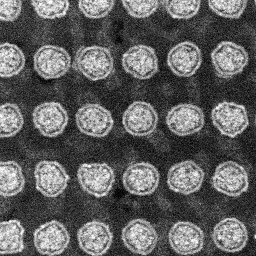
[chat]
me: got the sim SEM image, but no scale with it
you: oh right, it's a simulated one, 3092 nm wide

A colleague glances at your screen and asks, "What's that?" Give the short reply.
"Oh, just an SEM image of a regular array of raised bodies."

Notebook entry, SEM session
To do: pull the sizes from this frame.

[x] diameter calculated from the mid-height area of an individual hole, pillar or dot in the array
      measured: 389 nm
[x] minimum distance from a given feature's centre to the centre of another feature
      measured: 538 nm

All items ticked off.